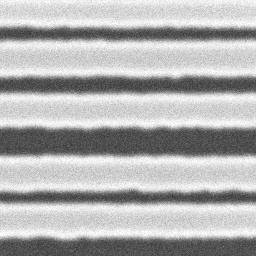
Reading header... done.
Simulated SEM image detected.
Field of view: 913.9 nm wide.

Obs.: lines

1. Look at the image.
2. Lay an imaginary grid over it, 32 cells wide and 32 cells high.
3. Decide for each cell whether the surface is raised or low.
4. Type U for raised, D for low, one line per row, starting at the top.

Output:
UUUUUUUUUUUUUUUUUUUUUUUUUUUUUUUU
UUUUUUUUUUUUUUUUUUUUUUUUUUUUUUUU
UUUUUUUUUUUUUUUUUUUUUUUUUUUUUUUU
DDDDDDDDDDDDDDDDDDDDDDDDDDDDDDDD
DDDDDDDDDDDDDDDDDDDDDDDDDDDDDDDD
UUUUUUUUUUUUUUUUUUUUUUUUUUUUUUUU
UUUUUUUUUUUUUUUUUUUUUUUUUUUUUUUU
UUUUUUUUUUUUUUUUUUUUUUUUUUUUUUUU
UUUUUUUUUUUUUUUUUUUUUUUUUUUUUUUU
UDDDDDDDDDDDDDDDDUDDDUDDDDDDDDDD
DDDDDDDDDDDDDDDDDDDDDDDDDDDDDDDD
DDDDDDDDDDDDDDDDDDDDDDDDDDDDDDDD
UUUUUUUUUUUUUUUUUUUUUUUUUUUUUUUU
UUUUUUUUUUUUUUUUUUUUUUUUUUUUUUUU
UUUUUUUUUUUUUUUUUUUUUUUUUUUUUUUU
UUUUUUUUUUUUUUUUUUUUUUUUUUUUUUUU
DDDDDDDDDDDDDDDDDDDDDDDDDDDDDDDD
DDDDDDDDDDDDDDDDDDDDDDDDDDDDDDDD
DDDDDDDDDDDDDDDDDDDDDDDDDDDDDDDD
DDDDDDDDDDDDDDDDDDDDDDDDDDDDDDDD
UUUUUUUUUUUUUUUUUUUUUUUUUUUUUUUU
UUUUUUUUUUUUUUUUUUUUUUUUUUUUUUUU
UUUUUUUUUUUUUUUUUUUUUUUUUUUUUUUU
UUUUUUUUUUUUUUUUDUUUUUUUUUUUUUUU
DDDDDDDDDDDDDDDDDDDDDDDDDDDDDDDD
DDDDDDDDDDDDDDDDDDDDDDDDDDDDDDDD
UUUUUUUUUUUUUUUUUUUUUUUUUUUUUUUU
UUUUUUUUUUUUUUUUUUUUUUUUUUUUUUUU
UUUUUUUUUUUUUUUUUUUUUUUUUUUUUUUU
UDUUDDDUUUDUDDDDDDUDUUUUDUDUDDDD
DDDDDDDDDDDDDDDDDDDDDDDDDDDDDDDD
DDDDDDDDDDDDDDDDDDDDDDDDDDDDDDDD